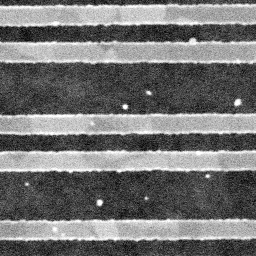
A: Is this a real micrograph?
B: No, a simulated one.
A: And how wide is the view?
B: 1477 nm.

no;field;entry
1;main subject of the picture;lines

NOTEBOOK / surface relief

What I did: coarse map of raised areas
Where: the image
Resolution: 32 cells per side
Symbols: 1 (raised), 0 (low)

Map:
00000000000000000000000000000000
11111111111111111111111111111111
11111111111111111111111111111111
00000000000000000000000000000000
00000000000000000000000000000000
11111111111111111111111111111111
11111111111111111111111111111111
11111111111111111111111111111111
00000000000000000000000000000000
00000000000000000000000000000000
00000000000000000000000000000000
00000000000000000000000000000000
00000000000000000000000000000000
00000000000000000000000000000000
00111111111111111111111111111111
11111111111111111111111111111111
11111111111111111111111111111111
00000000000000000000000000000000
00000000000000000000000000000000
11111111111111111111111111111111
11111111111111111111111111111111
00000000000000000000000000000000
00000000000000000000000000000000
00000000000000000000000000000000
00000000000000000000000000000000
00000000000000000000000000000000
00000000000000000000000000000000
00000000000000000000000100101110
11111111111111111111111111111111
11111111111111111111111111111111
00000000000000000000000000000000
00000000000000000000000000000000